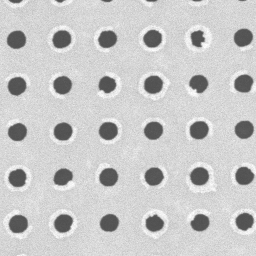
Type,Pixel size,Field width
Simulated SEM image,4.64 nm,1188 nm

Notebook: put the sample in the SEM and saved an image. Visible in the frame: a regular array of holes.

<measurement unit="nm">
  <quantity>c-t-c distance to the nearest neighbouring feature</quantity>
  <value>210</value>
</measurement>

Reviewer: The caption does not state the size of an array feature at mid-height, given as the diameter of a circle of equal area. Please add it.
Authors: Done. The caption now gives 86.1 nanometres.